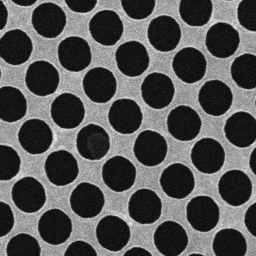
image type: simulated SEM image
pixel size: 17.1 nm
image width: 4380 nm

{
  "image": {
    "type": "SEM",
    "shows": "a regular array of holes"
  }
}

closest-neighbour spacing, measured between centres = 694 nm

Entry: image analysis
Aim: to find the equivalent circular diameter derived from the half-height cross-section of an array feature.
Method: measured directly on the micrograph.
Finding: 605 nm